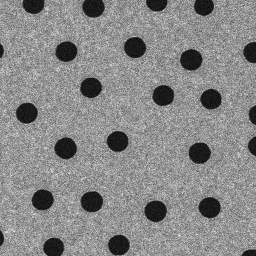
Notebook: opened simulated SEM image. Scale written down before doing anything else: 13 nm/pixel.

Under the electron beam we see a regular array of holes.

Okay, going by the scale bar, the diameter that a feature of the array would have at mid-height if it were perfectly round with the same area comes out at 280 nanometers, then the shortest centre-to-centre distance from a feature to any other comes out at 656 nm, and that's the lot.